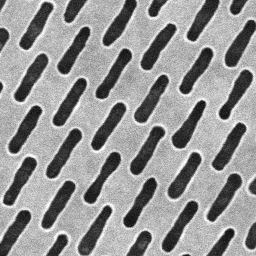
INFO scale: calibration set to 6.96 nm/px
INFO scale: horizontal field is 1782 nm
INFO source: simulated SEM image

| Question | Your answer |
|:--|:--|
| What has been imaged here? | a regular array of holes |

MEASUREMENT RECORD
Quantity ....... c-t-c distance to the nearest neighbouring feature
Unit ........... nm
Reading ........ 316